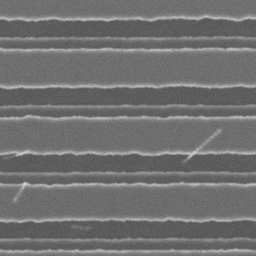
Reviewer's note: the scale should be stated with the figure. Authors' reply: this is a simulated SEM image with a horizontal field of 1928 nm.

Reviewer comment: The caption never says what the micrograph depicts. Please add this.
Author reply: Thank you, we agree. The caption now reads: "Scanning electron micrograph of lines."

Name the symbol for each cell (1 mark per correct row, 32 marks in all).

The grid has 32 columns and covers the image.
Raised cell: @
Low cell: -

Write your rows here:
@@@@@@@@@@@@@@@@@@@@@@@@@@@@@@@@
@@@@@@@@@@@@@@@@@@@@@@@@@@@@@@@@
---@@-----@--@----@----------@--
--------------------------------
--------------------------------
--------------------------------
@@@@@@@@@@@@@@@@@@@@@@@@@@@@@@@@
@@@@@@@@@@@@@@@@@@@@@@@@@@@@@@@@
@@@@@@@@@@@@@@@@@@@@@@@@@@@@@@@@
@@@@@@@@@@@@@@@@@@@@@@@@@@@@@@@@
@@@@@@@@@@@@@@@@@@@@@@@@@@@@@@@@
--------------------------------
--------------------------------
--------------------------------
---@----------------------------
@@@@@@@@@@@@@@@@@@@@@@@@@@@@@@@@
@@@@@@@@@@@@@@@@@@@@@@@@@@@@@@@@
@@@@@@@@@@@@@@@@@@@@@@@@@@@@@@@@
@@@@@@@@@@@@@@@@@@@@@@@@@@@@@@@@
--------------------------------
--------------------------------
--------------------------------
--------------------------------
@@@@@@@@@@@@@@@@@@@@@@@@@@@@@@@@
@@@@@@@@@@@@@@@@@@@@@@@@@@@@@@@@
@@@@@@@@@@@@@@@@@@@@@@@@@@@@@@@@
@@@@@@@@@@@@@@@@@@@@@@@@@@@@@@@@
@@@@@@@@@@@-@@@@@@@@@@@@@@@@@@-@
--------------------------------
--------------------------------
--------------------------------
@@@@@@@@@@@@@@@@@@@@@@@@@@@@@@@@